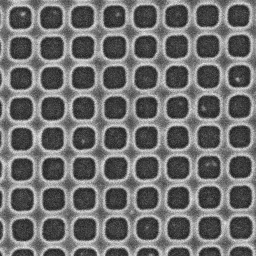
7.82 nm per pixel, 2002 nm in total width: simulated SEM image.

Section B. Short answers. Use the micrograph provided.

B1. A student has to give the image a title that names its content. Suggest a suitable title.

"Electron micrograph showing a regular array of holes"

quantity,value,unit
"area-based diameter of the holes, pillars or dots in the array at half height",197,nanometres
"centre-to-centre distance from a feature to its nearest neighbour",0.236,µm